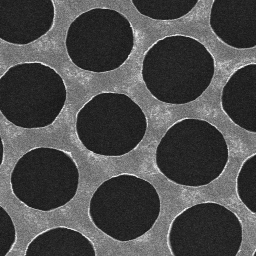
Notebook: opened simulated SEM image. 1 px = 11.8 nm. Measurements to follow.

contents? holes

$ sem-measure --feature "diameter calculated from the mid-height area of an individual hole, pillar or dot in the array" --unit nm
794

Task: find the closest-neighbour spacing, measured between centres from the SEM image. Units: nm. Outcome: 992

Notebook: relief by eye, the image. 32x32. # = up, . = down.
.......##########........##.....
.......####....##.......##......
.......##.......##########......
......###.......##########......
.....###.........#####.####.....
##.#####.........##......###....
########........##........######
#########.......##.........#####
#.....####.....###.........###..
.......###########.........##...
........##########........##....
........###########......###....
........###.....####....####....
........##........##########....
#......###........###########...
##....####........####....####..
##########........###.......###.
##########........##........####
#####.#####......###........####
###......##########..........###
##.......###########........##..
##........##########........##..
#.........###.....###......###..
##........##.......###########..
##.......###........##########..
###.....###.........#####..####.
.##########.........###......###
.###########........##........##
..#####.####.......##.........##
..###.....####....###.........##
..##.......##########.........##
.##.........##########........##